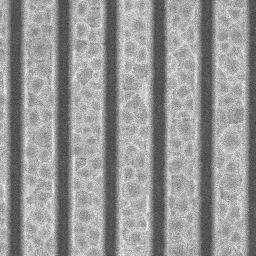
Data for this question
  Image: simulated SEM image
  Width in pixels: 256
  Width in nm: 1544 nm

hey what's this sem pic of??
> parallel lines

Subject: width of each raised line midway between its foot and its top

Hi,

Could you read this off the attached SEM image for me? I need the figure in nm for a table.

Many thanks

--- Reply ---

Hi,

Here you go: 196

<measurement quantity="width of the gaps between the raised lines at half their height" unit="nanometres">92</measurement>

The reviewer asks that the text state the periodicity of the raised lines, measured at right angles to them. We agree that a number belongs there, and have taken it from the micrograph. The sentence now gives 288 nm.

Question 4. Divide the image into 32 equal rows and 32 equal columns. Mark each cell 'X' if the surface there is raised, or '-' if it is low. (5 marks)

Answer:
X--XXXX--XXXX--XXXX--XXXX--XXXX-
X--XXXX--XXXX--XXXX--XXXX--XXXX-
X--XXXX--XXXX--XXXX--XXXX--XXXX-
X--XXXX--XXXX--XXXX--XXXX--XXXX-
X--XXXX--XXXX--XXXX--XXXX--XXXX-
X--XXXX--XXXX--XXXX--XXXX--XXXX-
X--XXXX--XXXX--XXXX--XXXX--XXXX-
X--XXXX--XXXX--XXXX--XXXX--XXXX-
X--XXXX--XXXX--XXXX--XXXX--XXXX-
X--XXXX--XXXX--XXXX--XXXX--XXXX-
X--XXXX--XXXX--XXXX--XXXX--XXXX-
X--XXXX--XXXX--XXXX--XXXX--XXXX-
X--XXXX--XXXX--XXXX--XXXX--XXXX-
X--XXXX--XXXX--XXXX--XXXX--XXXX-
X--XXXX--XXXX--XXXX--XXXX--XXXX-
X--XXXX--XXXX--XXXX--XXXX--XXXX-
X--XXXX--XXXX--XXXX--XXXX--XXXX-
X--XXXX--XXXX--XXXX--XXXX--XXXX-
X--XXXX--XXXX--XXXX--XXXX--XXXX-
X--XXXX--XXXX--XXXX--XXXX--XXXX-
X--XXXX--XXXX--XXXX--XXXX--XXXX-
X--XXXX--XXXX--XXXX--XXXX--XXXX-
X--XXXX--XXXX--XXXX--XXXX--XXXX-
X--XXXX--XXXX--XXXX--XXXX--XXXX-
X--XXXX--XXXX--XXXX--XXXX--XXXX-
X--XXXX--XXXX--XXXX--XXXX--XXXX-
X--XXXX--XXXX--XXXX--XXXX--XXXX-
X--XXXX--XXXX--XXXX--XXXX--XXXX-
X--XXXX--XXXX--XXXX--XXXX--XXXX-
X--XXXX--XXXX--XXXX--XXXX--XXXX-
X--XXXX--XXXX--XXXX--XXXX--XXXX-
X--XXXX--XXXX--XXXX--XXXX--XXXX-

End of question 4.